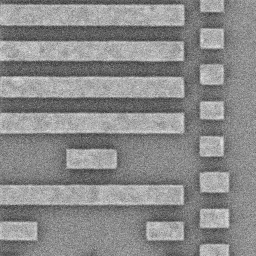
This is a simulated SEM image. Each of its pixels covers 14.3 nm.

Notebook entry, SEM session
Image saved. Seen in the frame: wiring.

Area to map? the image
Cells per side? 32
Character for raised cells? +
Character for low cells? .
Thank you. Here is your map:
.........................+++....
+++++++++++++++++++++++.........
+++++++++++++++++++++++.........
................................
.........................+++....
+++++++++++++++++++++++..+++....
+++++++++++++++++++++++.........
+++++++++++++++++++++++.........
.........................+++....
.........................+++....
+++++++++++++++++++++++.........
+++++++++++++++++++++++.........
................................
.........................+++....
+++++++++++++++++++++++..+++....
+++++++++++++++++++++++.........
+++++++++++++++++++++++.........
.........................+++....
.........................+++....
........++++++..................
........++++++..................
................................
.........................+++....
+++++++++++++++++++++++..+++....
+++++++++++++++++++++++.........
+++++++++++++++++++++++.........
.........................+++....
.........................+++....
++++..............+++++.........
++++..............+++++.........
................................
.........................+++....